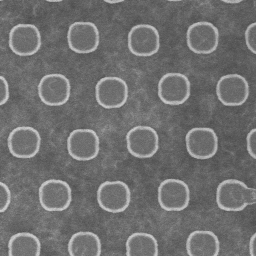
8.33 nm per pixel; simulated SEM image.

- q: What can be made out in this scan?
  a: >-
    a regular array of raised bodies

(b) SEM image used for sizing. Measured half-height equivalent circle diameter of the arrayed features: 258 nanometers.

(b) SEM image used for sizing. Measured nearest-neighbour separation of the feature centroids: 0.484 µm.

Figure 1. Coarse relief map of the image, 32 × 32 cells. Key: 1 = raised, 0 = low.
00000000000000000000000000000000
00000000000000000000000000000000
00000000000000000000000000000000
00110000011100000110000011100001
01111000011100001111000011100001
01111000011100001111000011100001
00110000000000000110000001000000
00000000000000000000000000000000
00000000000000000000000000000000
00000011000000000000011000001100
10000111000011110000111100011110
10000111100011110000111100011110
10000111000011110000111000001110
00000000000000000000000000000000
00000000000000000000000000000000
00000000000000000000000000000000
00110000011100001110000011100001
01111000011100001111000111100001
01111000011100001111000111100001
00110000011100000000000011000000
00000000000000000000000000000000
00000000000000000000000000000000
00000000000000000000000000000000
10000111100001110000111000011110
10000111100011110000111000011111
10000111000001110000111000011110
00000000000000000000000000000000
00000000000000000000000000000000
00000000000000000000000000000000
00110000011100000110000011100000
01111000011100001110000111100001
01111000011100001110000011100001